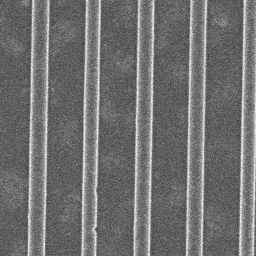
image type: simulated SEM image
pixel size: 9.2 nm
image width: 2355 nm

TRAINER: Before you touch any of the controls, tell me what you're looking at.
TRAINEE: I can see parallel lines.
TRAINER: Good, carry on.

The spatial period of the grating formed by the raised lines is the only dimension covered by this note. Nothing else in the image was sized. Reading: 484 nanometers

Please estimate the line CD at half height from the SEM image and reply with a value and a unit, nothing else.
142 nanometers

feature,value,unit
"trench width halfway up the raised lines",348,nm